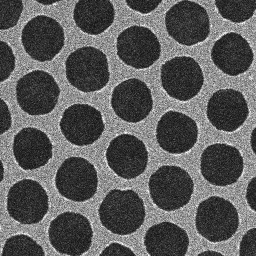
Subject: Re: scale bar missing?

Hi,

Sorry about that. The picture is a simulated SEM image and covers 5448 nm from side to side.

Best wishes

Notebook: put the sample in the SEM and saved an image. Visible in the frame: a regular array of holes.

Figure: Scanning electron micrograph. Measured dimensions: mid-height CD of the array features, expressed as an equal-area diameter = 0.939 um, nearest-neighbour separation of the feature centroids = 1150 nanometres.